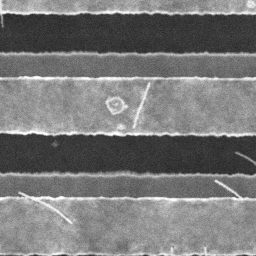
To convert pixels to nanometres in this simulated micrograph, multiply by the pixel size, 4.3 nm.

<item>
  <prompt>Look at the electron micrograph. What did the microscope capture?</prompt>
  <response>lines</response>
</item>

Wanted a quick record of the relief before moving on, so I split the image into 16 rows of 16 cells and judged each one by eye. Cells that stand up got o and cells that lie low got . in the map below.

oooooooooooooooo
................
................
oooooooooooooooo
oooooooooooooooo
oooooooooooooooo
oooooooooooooooo
oooooooooooooooo
................
................
................
oooooooooooooooo
oooooooooooooooo
oooooooooooooooo
oooooooooooooooo
oooooooooooooooo